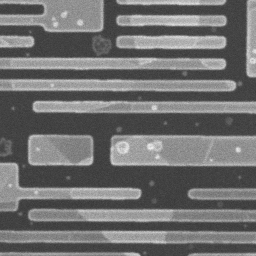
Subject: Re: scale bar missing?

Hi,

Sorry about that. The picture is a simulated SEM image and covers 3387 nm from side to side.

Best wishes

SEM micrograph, wiring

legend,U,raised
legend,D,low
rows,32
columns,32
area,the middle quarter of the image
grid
UUUUUUUUUUUUUUUUUUUUUUUUUUUUUUUU
DDDDDDDDDDDDDDDDDDDDDDDDDDDDDDDD
DDDDDDDDDDDDDDDDDDDDDDDDDDDDDDDD
DDDDDDDDDDDDDDDDDDDDDDDDDDDDDDDD
UUUUUUUUUUUUUUUUUUUUUUUUUUUUUUUU
UUUUUUUUUUUUUUUUUUUUUUUUUUUUUUUU
DDDDDDDDDDDDDDDDDDDDDDDDDDDDDDDD
DDDDDDDDDDDDDDDDDDDDDDDDDDDDDDDD
DDDDDDDDDDDDDDDDDDDDDDDDDDDDDDDD
DDDDDDDDDDDDDDDDDDDDDDDDDDDDDDDD
UUUUUUUUUUUUUUUUUUUUUUUUUUUUUUUU
UUUUUUUUUUUUUUUUUUUUUUUUUUUUUUUU
DDDDDDDDDDDDDDDDDDDDDDDDDDDDDDDD
DDDDDDDDDDDDDDDDDDDDDDDDDDDDDDDD
DDDDDDDDDDDDDDDDDDDDDDDDDDDDDDDD
DDDDDDDDDDDDDDDDDDDDDDDDDDDDDDDD
DDDDDDDDDDDDDUDDDDDDDDDDDDDDDDDD
DDDDDDDDDDDDDDDDDDDDDDDDDDDDDDDD
UUUUUUUDDDDDUUUUUUUUUUUUUUUUUUUU
UUUUUUUDDDDDUUUUUUUUUUUUUUUUUUUU
UUUUUUUDDDDDUUUUUUUUUUUUUUUUUUUU
UUUUUUUDDDDDUUUUUUUUUUUUUUUUUUUU
UUUUUUUDDDDDUUUUUUUUUUUUUUUUUUUU
UUUUUUUDDDDDUUUUUUUUUUUUUUUUUUUU
UUUUUUUDDDDDUUUUUUUUUUUUUUUUUUUU
DDDDDDDDDDDDDDDDDDDDDDDDDDDDDDDD
DDDDDDDDDDDDDDDDDDDDDDDDDDDDDDDD
DDDDDDDDDDDDDDDDDDDDDDDDDDDDDDDD
DDDDDDDDDDDDDDDDDDDDDDDDDDDDDDDD
DDDDDDDDDDDDDDDDDDDDDDDDDDDDDDDD
DDDDDDDDDDDDDDDDDDDDDDDDDDDDDDDD
UUUUUUUUUUUUUUUUUUUDDDDDDDDDDDDD